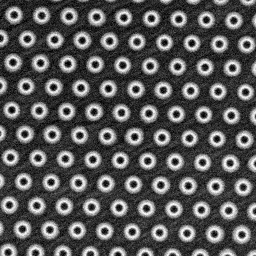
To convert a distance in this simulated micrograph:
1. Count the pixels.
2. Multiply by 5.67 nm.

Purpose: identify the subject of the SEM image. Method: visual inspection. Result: an array of small figures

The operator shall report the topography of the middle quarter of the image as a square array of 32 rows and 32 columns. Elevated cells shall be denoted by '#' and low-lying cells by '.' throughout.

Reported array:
###...####...####...####..####..
##....###....###....###...####..
.....................#.....##...
................................
...###....##.....##.............
..####...####...####...####...##
..####...####...####...####...##
...###...####...####...####...##
........................##....##
................................
##....###....###....##..........
###..#####..####...####...####..
###...###...####...####...####..
##....###....###...####...####..
...........................##...
................................
..###....###....###.....#.......
..####...####...####...###....##
..####...####...####...###...###
...##....###....###....###....##
...............................#
................................
##....###....###....##.....##...
##...####...####...####...####..
##...####...####...####...####..
#.....###....###...####...####..
...........................#....
................................
..###....###....###....##.....##
..####..#####..####...####...###
..####..#####..####...####...###
..###....###....###...####...###